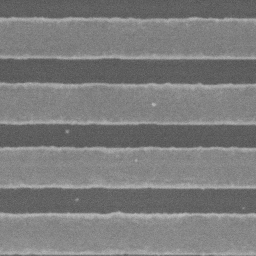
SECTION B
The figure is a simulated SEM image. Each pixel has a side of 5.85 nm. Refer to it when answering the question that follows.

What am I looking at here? lines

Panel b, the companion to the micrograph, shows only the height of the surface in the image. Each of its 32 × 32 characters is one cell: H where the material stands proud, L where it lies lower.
LLLLLLLLLLLLLLLLLLLLLLLLLLLLLLLL
LLLLLLLLLLLLLLLLLLLLLLLLLLLLLLLL
HHHHHHHHHHHHHHHHHHHHHHHHHHHHHHHH
HHHHHHHHHHHHHHHHHHHHHHHHHHHHHHHH
HHHHHHHHHHHHHHHHHHHHHHHHHHHHHHHH
HHHHHHHHHHHHHHHHHHHHHHHHHHHHHHHH
HHHHHHHHHHHHHHHHHHHHHHHHHHHHHHHH
LLLLLLLLLLLLLLLLLLLLLLLLLLLLLLLL
LLLLLLLLLLLLLLLLLLLLLLLLLLLLLLLL
LLLLLLLLLLLLLLLLLLLLLLLLLLLLLLLL
HHHHHHLLLLHHHHLLLLLLLLLLLLLLLLLL
HHHHHHHHHHHHHHHHHHHHHHHHHHHHHHHH
HHHHHHHHHHHHHHHHHHHHHHHHHHHHHHHH
HHHHHHHHHHHHHHHHHHHHHHHHHHHHHHHH
HHHHHHHHHHHHHHHHHHHHHHHHHHHHHHHH
LLLLLLLLLLLLLHHLLLLHHHHLHHLLLHHH
LLLLLLLLLLLLLLLLLLLLLLLLLLLLLLLL
LLLLLLLLLLLLLLLLLLLLLLLLLLLLLLLL
HHHHHHHHHLLHHLLLLHHHLHLLHHHHHHLL
HHHHHHHHHHHHHHHHHHHHHHHHHHHHHHHH
HHHHHHHHHHHHHHHHHHHHHHHHHHHHHHHH
HHHHHHHHHHHHHHHHHHHHHHHHHHHHHHHH
HHHHHHHHHHHHHHHHHHHHHHHHHHHHHHHH
LLLLLLLLLLLLLLLLLLLLLLLLLLLLLLLL
LLLLLLLLLLLLLLLLLLLLLLLLLLLLLLLL
LLLLLLLLLLLLLLLLLLLLLLLLLLLLLLLL
LLLLLLLLLLLLLLLLLLLLLLLLLLLLLLLL
HHHHHHHHHHHHHHHHHHHHHHHHHHHHHHHH
HHHHHHHHHHHHHHHHHHHHHHHHHHHHHHHH
HHHHHHHHHHHHHHHHHHHHHHHHHHHHHHHH
HHHHHHHHHHHHHHHHHHHHHHHHHHHHHHHH
HHHHHHHHHHHHHHHHHHHHHHHHHHHHHHHH